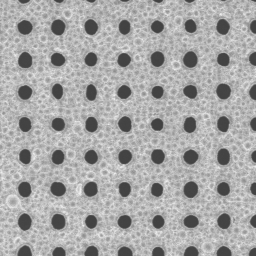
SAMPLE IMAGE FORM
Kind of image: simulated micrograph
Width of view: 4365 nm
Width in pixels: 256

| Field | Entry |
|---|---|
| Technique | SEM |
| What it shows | a regular array of holes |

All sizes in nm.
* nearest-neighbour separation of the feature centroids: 548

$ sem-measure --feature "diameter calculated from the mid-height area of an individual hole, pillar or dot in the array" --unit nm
240